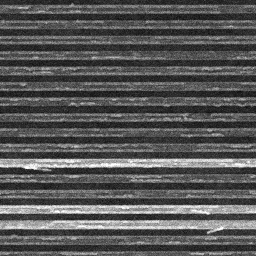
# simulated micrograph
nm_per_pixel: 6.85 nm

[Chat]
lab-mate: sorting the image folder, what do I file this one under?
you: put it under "parallel lines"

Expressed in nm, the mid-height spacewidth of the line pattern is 47.9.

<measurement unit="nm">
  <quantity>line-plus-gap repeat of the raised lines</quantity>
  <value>105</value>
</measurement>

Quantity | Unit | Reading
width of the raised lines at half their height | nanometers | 54.8